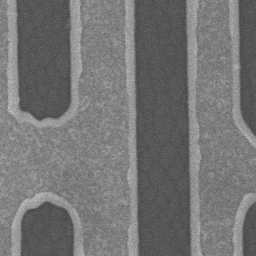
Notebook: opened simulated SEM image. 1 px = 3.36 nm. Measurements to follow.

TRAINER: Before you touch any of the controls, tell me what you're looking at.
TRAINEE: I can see one or a few lines or trenches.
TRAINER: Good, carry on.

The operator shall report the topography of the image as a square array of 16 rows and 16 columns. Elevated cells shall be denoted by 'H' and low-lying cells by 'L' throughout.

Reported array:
HLLLLHHHLLLLHHHL
HLLLLHHHLLLLHHHL
HLLLLHHHLLLLHHHL
HLLLLHHHLLLLHHHL
HLLLLHHHLLLLHHHL
HLLLLHHHLLLLHHHL
HLLLLHHHLLLLHHHL
HHLLHHHHLLLLHHHL
HHHHHHHHLLLLHHHH
HHHHHHHHLLLLHHHH
HHHHHHHHLLLLHHHH
HHHHHHHHLLLLHHHH
HHHHHHHHLLLLHHHH
HLLLLHHHLLLLHHHL
HLLLLHHHLLLLHHHL
HLLLLHHHLLLLHHHL